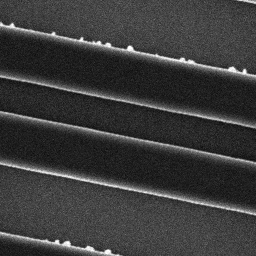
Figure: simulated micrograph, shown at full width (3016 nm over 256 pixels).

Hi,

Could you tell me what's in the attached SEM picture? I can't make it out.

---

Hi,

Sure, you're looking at lines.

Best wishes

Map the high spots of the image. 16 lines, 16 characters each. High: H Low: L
LLLLLLLLLLLLLLLL
LLLLLLLLLLLLLLLL
HHHHHLLLLLLLLLLL
HHHHHHHHHHLLLLLL
HHHHHHHHHHHHHHHL
LLLLHHHHHHHHHHHH
LLLLLLLLHHHHHHHH
HHHLLLLLLLLLLLHH
HHHHHHHHLLLLLLLL
HHHHHHHHHHHHHLLL
LHHHHHHHHHHHHHHH
LLLLLLHHHHHHHHHH
LLLLLLLLLLLHHHHH
LLLLLLLLLLLLLLLL
LLLLLLLLLLLLLLLL
HHHHHLLLLLLLLLLL